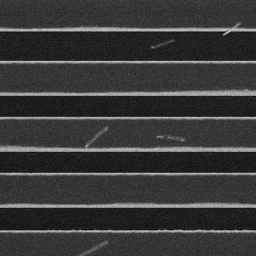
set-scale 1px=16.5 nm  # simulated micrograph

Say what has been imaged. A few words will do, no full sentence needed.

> lines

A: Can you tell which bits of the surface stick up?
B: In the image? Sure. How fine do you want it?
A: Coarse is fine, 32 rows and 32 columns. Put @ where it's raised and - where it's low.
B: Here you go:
@@@@@@@@@@@@@@@@@@@@@@@@@@@@@@@@
@@@@@@@@@@@@@@@@@@@@@@@@@@@@@@@@
@@@@@@@@@@@@@@@@@@@@@@@@@@@@@@@@
@@@@@@@@@@@@@@@@@@@@@@@@@@@@@@@@
--------------------------------
--------------------------------
--------------------------------
--------------------------------
@@@@@@@@@@@@@@@@@@@@@@@@@@@@@@@@
@@@@@@@@@@@@@@@@@@@@@@@@@@@@@@@@
@@@@@@@@@@@@@@@@@@@@@@@@@@@@@@@@
@@@@@@@@@@@@@@@@@@@@@@@@@@@@@@@@
--------------------------------
--------------------------------
--------------------------------
@@@@@@@@@@@@@@@@@@@@@@@@@@@@@@@@
@@@@@@@@@@@@@@@@@@@@@@@@@@@@@@@@
@@@@@@@@@@@@@@@@@@@@@@@@@@@@@@@@
@@@@@@@@@@@@@@@@@@@@@@@@@@@@@@@@
--------------------------------
--------------------------------
--------------------------------
@@@@@@@@@@@@@@@@@@@@@@@@@@@@@@@@
@@@@@@@@@@@@@@@@@@@@@@@@@@@@@@@@
@@@@@@@@@@@@@@@@@@@@@@@@@@@@@@@@
@@@@@@@@@@@@@@@@@@@@@@@@@@@@@@@@
--------------------------------
--------------------------------
--------------------------------
@@@@@@@@@@@@@@@@@@@@@@@@@@@@@@@@
@@@@@@@@@@@@@@@@@@@@@@@@@@@@@@@@
@@@@@@@@@@@@@@@@@@@@@@@@@@@@@@@@